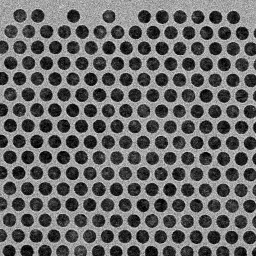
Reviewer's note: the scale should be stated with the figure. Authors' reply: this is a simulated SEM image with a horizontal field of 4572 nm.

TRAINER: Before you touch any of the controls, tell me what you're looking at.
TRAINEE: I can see a regular array of holes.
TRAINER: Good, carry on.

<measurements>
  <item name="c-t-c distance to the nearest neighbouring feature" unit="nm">315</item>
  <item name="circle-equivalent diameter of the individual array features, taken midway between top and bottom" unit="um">0.244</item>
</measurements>